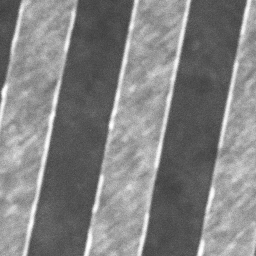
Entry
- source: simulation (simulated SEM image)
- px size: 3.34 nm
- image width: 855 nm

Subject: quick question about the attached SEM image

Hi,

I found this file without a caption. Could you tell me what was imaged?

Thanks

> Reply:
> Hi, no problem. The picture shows one or a few lines or trenches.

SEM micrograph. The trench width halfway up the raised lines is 190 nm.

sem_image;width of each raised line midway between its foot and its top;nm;181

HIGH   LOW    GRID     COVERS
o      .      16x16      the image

.oooo...oooo...o
.oooo...oooo...o
.ooo....ooo....o
.ooo....ooo....o
oooo....ooo....o
oooo...oooo...oo
oooo...oooo...oo
ooo....ooo....oo
ooo....ooo....oo
ooo....ooo....oo
ooo...oooo...ooo
ooo...oooo...ooo
oo....ooo....ooo
oo....ooo....ooo
oo....ooo....ooo
oo...oooo...oooo